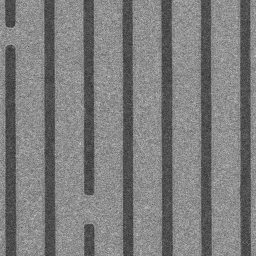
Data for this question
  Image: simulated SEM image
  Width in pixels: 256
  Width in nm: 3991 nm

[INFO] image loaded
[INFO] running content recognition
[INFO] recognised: parallel lines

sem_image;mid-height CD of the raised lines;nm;435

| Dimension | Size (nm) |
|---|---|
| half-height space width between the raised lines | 172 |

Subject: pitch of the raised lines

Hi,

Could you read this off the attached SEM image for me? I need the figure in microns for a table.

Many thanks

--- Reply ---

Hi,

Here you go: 0.611